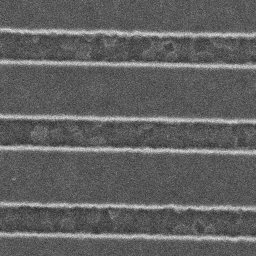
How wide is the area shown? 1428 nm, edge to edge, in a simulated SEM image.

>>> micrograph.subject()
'one or a few lines or trenches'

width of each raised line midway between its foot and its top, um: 0.31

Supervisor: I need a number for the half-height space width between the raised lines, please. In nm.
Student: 170